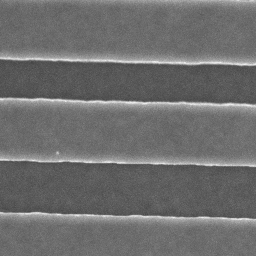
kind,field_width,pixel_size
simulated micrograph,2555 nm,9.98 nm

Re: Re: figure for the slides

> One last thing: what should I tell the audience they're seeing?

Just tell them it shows lines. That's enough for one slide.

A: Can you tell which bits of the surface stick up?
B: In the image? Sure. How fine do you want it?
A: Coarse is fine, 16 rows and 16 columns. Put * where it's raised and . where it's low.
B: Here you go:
****************
****************
****************
****************
................
................
************....
****************
****************
****************
................
................
................
*******.*.......
****************
****************